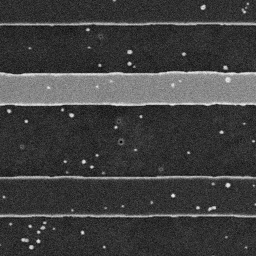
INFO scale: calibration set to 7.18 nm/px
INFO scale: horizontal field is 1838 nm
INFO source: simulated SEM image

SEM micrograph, lines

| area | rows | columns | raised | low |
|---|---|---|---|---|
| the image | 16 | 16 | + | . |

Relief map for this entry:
++++++++++++++++
++++++++++.+...+
................
................
................
++++++++++++++++
++++++++++++++++
................
................
................
................
++++++++++++++++
++++++++++++++++
.+.+.+++++....++
................
................